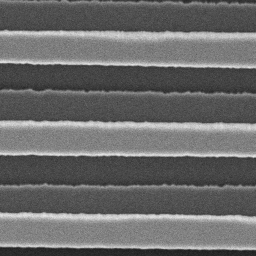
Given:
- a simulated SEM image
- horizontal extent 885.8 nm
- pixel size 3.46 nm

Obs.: lines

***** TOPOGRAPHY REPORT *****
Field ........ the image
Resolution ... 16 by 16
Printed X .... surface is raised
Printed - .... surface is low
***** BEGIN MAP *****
----------------
----------------
XXXXXXXXXXXXXXXX
XXXXXXXXXXXXXXXX
----------------
----------------
----------------
----------------
XXXXXXXXXXXXXXXX
XXXXXXXXXXXXXXXX
----------------
----------------
----------------
XXXXXXXXXXXXXXX-
XXXXXXXXXXXXXXXX
-------XXXXXXXXX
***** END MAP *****